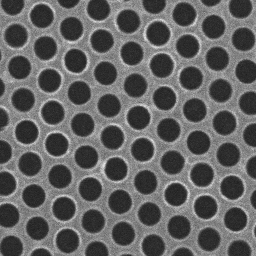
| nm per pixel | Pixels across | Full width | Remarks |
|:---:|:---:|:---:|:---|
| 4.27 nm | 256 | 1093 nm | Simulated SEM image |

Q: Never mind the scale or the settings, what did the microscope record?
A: a regular array of holes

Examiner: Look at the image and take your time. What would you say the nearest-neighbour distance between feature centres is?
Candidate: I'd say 32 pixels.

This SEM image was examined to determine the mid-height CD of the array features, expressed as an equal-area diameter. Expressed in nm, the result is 103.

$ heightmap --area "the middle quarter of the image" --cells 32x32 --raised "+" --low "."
.....+++.....++++++++.......+++.
+....+++.....+++++++++.....+++..
+++++++......++++..+++.....++...
++++++++.....+++....++++.++++...
++...++++....++......++++++++...
+.....+++++++++......++++.+++...
+......++++++++......++....++++.
+......+++..++++....++......++++
+......++....++++.++++......++++
++....++......++++++++......++..
++++++++......++++.++++....+++..
+++++++++.....++.....+++..++++..
+++...+++....+++.....+++++++++..
++.....+++++++++......+++..+++..
++......++++++++.....+++....++++
++......+++..++++....++......+++
++.....+++....++++.++++......+++
+++....++......++++++++......++.
+++++++++......++++.++++....+++.
.++++++++......++.....++++.++++.
.+++..++++....+++.....+++++++++.
.++.....++++.++++......++++++++.
+++......++++++++.....+++....+++
+++......+++..+++.....++......++
+++.....+++....++++.++++......++
++++....++......++++++++......++
.+++++++++......++++.++++.....++
..++++++++......++.....+++..++++
..+++...+++....+++.....+++++++++
..++.....++++++++......+++++++++
.+++......++++++++.....+++....++
++++......+++..+++.....++......+